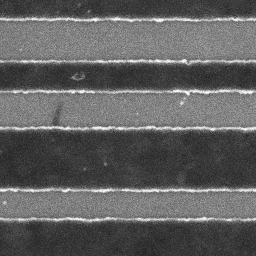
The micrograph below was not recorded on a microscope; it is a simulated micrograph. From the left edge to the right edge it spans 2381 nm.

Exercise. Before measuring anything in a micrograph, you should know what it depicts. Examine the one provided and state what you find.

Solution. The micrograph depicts one or a few lines or trenches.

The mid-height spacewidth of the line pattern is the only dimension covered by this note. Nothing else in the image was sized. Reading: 328 nm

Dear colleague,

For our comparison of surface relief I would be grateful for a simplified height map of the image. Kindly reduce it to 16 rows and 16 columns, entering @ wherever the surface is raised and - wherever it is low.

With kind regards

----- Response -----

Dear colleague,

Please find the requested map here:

@@@@@@@@@@@@@@@@
----------------
----------------
----------------
@@@@@@@@@@@@@@@@
@@@@@@@@@@@@@@@@
----------------
----------------
@@@@@@@@@@@@@@@@
@@@@@@@@@@@@@@@@
@@@@@@@@@@@@@@@@
@@@@@@@@@@@@@@@@
----------------
----------------
@@@@@@@@@@@@@@@@
@@@@@@@@@@@@@@@@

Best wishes